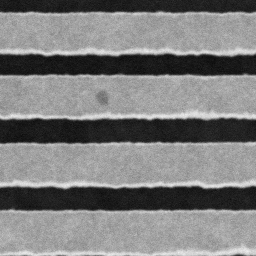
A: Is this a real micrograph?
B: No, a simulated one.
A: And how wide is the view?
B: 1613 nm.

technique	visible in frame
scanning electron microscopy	lines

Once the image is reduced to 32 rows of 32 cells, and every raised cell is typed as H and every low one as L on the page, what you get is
LLLLLLLLLLLLLLLLLLLLLLLLLLLLLLLL
LLLLLLLLLLLLLLLLLLLLLLLLLLLLLLLL
HHHHHHHHHHHHHHHHHHHHHHHHHHHHHHHH
HHHHHHHHHHHHHHHHHHHHHHHHHHHHHHHH
HHHHHHHHHHHHHHHHHHHHHHHHHHHHHHHH
HHHHHHHHHHHHHHHHHHHHHHHHHHHHHHHH
HHHHHHHHHHHHHHHHHHHHHHHHHHHHHHHH
LLLLLLLLLLLLLLLLLLLLLLLLLLLLLLLL
LLLLLLLLLLLLLLLLLLLLLLLLLLLLLLLL
LLLLHLHHLHHHHLHLLLLLHLLHLLLLLLLL
HHHHHHHHHHHHHHHHHHHHHHHHHHHHHHHH
HHHHHHHHHHHHHHHHHHHHHHHHHHHHHHHH
HHHHHHHHHHHHHHHHHHHHHHHHHHHHHHHH
HHHHHHHHHHHHHHHHHHHHHHHHHHHHHHHH
HHHHHHHHHHHHHHHHHHHHHHHHHHHHHHHH
LLLLLLLLLLLLLLLLLLLLLLLLLLLLLLLL
LLLLLLLLLLLLLLLLLLLLLLLLLLLLLLLL
LLLLLLLLLLLLLLLLLLLLLLLLLLLLLLLL
HHHHHHHHHHHHHHHHHHHHHHHHHHHHHHHH
HHHHHHHHHHHHHHHHHHHHHHHHHHHHHHHH
HHHHHHHHHHHHHHHHHHHHHHHHHHHHHHHH
HHHHHHHHHHHHHHHHHHHHHHHHHHHHHHHH
HHHHHHHHHHHHHHHHHHHHHHHHHHHHHHHH
LLLLLLLLLLLLLLHLLLLLLLLLLLLLLLLL
LLLLLLLLLLLLLLLLLLLLLLLLLLLLLLLL
LLLLLLLLLLLLLLLLLLLLLLLLLLLLLLLL
HHHHHHHHHHHHHHHHHHHHHHHHHHHHHHHH
HHHHHHHHHHHHHHHHHHHHHHHHHHHHHHHH
HHHHHHHHHHHHHHHHHHHHHHHHHHHHHHHH
HHHHHHHHHHHHHHHHHHHHHHHHHHHHHHHH
HHHHHHHHHHHHHHHHHHHHHHHHHHHHHHHH
HHHHHHHHHHHHHHHHHHHHHHHHHHHHHHHH